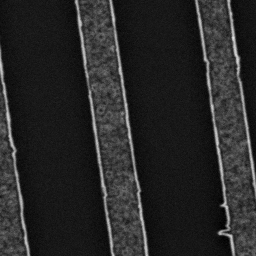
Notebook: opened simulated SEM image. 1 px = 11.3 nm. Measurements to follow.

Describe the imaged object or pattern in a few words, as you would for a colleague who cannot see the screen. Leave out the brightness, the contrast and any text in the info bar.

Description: one or a few lines or trenches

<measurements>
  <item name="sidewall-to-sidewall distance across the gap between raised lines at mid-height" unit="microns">0.944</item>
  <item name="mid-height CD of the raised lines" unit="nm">390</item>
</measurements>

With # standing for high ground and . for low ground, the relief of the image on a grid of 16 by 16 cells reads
.....##.....##..
.....##.....###.
.....##......##.
.....##......##.
.....###.....##.
......##.....##.
......##.....##.
#.....##.....##.
#.....##.....###
#.....##......##
#.....##......##
#.....###.....##
#......##.....##
#......##.....##
##.....##.....##
##.....##......#